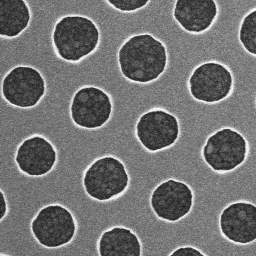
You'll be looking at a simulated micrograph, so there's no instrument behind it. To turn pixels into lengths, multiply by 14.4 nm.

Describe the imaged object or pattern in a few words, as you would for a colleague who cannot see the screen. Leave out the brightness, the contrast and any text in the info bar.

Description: a regular array of holes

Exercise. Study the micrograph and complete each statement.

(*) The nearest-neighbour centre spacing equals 1010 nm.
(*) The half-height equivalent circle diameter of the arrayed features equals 592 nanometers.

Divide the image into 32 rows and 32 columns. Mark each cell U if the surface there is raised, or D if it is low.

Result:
DDDUUUUUUUUUUUDDDDUUUUDDDDDUUUUU
DDDDUUUUUUUUUUUUUUUUUUDDDDDUUUUU
DDDDUUUUDDDUUUUUUUUUUUDDDDDUUUDD
DDDUUUUDDDDDUUUUUUUUUUUDDDUUUUDD
DDUUUUUDDDDDUUUUUDDUUUUUUUUUUUDD
UUUUUUUDDDDDUUUUDDDDUUUUUUUUUUDD
UUUUUUUDDDDUUUUDDDDDDUUUUUUUUUUD
UUUUUUUUDDUUUUUDDDDDDUUUUUUUUUUU
UUDDUUUUUUUUUUUDDDDDDUUUUDDDUUUU
UDDDDUUUUUUUUUUUDDDDUUUUDDDDDUUU
DDDDDUUUUUUUUUUUUUUUUUUUDDDDDUUU
DDDDDUUUUUDDDUUUUUUUUUUUDDDDDUUU
UDDDDUUUUDDDDDUUUUUUUUUUUDDUUUUU
UUUUUUUUUDDDDDUUUUUUUUUUUUUUUUUU
UUUUUUUUUDDDDDUUUUDDDDUUUUUUUUUU
UUUUUUUUUUDDDUUUUDDDDDUUUUUUUUUU
UUUUUUUUUUUUUUUUUDDDDDUUUUUDDDUU
UUUDDDUUUUUUUUUUUDDDDDUUUUDDDDDU
UUDDDDDUUUUUUUUUUUDDUUUUUDDDDDDU
UUDDDDDUUUUUUUUUUUUUUUUUUDDDDDDU
UUDDDDDUUUUUDDDUUUUUUUUUUUDDDDUU
UUUDDDUUUUUDDDDDUUUUUUUUUUUUUUUU
UUUUUUUUUUUDDDDDUUUUUUUUUUUUUUUU
UUUUUUUUUUUDDDDDUUUUDDDDUUUUUUUU
UUUUUUUUUUUDDDDUUUUDDDDDUUUUUUUU
DUUUUUUUUUUUUUUUUUUDDDDDUUUUUDDU
DUUUUDDDDUUUUUUUUUUDDDDUUUUUDDDD
UUUUDDDDDUUUUUUUUUUUUDUUUUUUDDDD
UUUUDDDDDUUUUUDUUUUUUUUUUUUUDDDD
UUUUDDDDDUUUUDDDDUUUUUUUUUUUDDDD
UUUUUDDDUUUUDDDDDUUUUUUUUUUUUUUU
UUUUUUUUUUUUDDDDDUUUUUDDDUUUUUUU